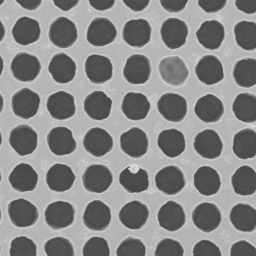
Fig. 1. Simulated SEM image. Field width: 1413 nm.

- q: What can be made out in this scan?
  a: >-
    a regular array of holes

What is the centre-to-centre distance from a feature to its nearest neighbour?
0.198 um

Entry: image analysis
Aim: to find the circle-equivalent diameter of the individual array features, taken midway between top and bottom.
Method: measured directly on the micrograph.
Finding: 153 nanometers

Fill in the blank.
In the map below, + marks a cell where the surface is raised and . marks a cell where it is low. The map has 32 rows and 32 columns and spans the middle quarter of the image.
...++.......+++......++++...++++
...++.......+++......++++....+++
...+++......+++......++++....+++
..++++.....+++++.....++++.....++
.++++++...++++++....++++++..++++
++++++++++++++++++++++++++++++++
++++++++++++++++++++++++++++++++
.++++++...++++++...++++++...++++
..++++.....++++......+++......++
...++.......+++......++........+
...++.......+++.......+........+
...++.......+++......+++.......+
..++++.....++++......+++......++
.++++++....+++++....+++++.....++
++++++++++++++++++++++++++++++++
++++++++++++++++++++++++++++++++
.++++++...+++++++..+++++++..++++
..++++.....++++.....++++......++
..+++.......++.......+++......++
...++.......++.......++.......++
...++.......++.......++.......++
...+++.....++++......+++......++
.++++++...++++++....+++++....+++
++++++++++++++++++++++++++++++++
++++++++++++++++++++++++++++++++
.++++++..+++++++++++++++++.+++++
..++++.....++++.+++.++++....++++
..+++.......++.......++......+++
...++.......++.......++.......++
...++.......++.......++.......++
..+++......++++......++.......++
.+++++....++++++....++++.....+++